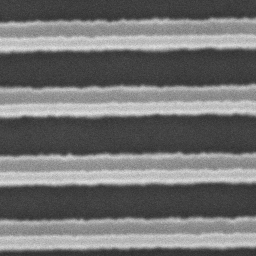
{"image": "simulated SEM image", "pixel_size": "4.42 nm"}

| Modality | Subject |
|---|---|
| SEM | lines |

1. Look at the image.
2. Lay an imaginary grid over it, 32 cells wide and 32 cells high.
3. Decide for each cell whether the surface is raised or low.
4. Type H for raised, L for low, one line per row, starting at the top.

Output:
LLLLLLLLLLLLLLLLLLLLLLLLLLLLLLLL
LLLLLLLLLLLLLLLLLLLLLLLLLLLLLLLL
LLLLLLLLLLLLLLLLLLLLLLLLLLLLLLLL
HHHHHHHHHHHHHHHHHHHHHHHHHHHHHHHH
HHHHHHHHHHHHHHHHHHHHHHHHHHHHHHHH
HHHHHHHHHHHHHHHHHHHHHHHHHHHHHHHH
LLLLLLLLLLLLLLLLLLLLLLLLLLLLLLLL
LLLLLLLLLLLLLLLLLLLLLLLLLLLLLLLL
LLLLLLLLLLLLLLLLLLLLLLLLLLLLLLLL
LLLLLLLLLLLLLLLLLLLLLLLLLLLLLLLL
LLLLLLLLLLLLLLLLLLLLLLLLLLLLLLLL
HHHHHHHHHHHHHHHHHHHHHHHHHHHHHHHH
HHHHHHHHHHHHHHHHHHHHHHHHHHHHHHHH
HHHHHHHHHHHHHHHHHHHHHHHHHHHHHHHH
LLLLLLLLLLLLLLLLLLLLLLLLLLLLLLLL
LLLLLLLLLLLLLLLLLLLLLLLLLLLLLLLL
LLLLLLLLLLLLLLLLLLLLLLLLLLLLLLLL
LLLLLLLLLLLLLLLLLLLLLLLLLLLLLLLL
LLLLLLLLLLLLLLLLLLLLLLLLLLLLLLLL
LLLLLLLLLLLLLHLLLLHLHHHHHHHHHHHH
HHHHHHHHHHHHHHHHHHHHHHHHHHHHHHHH
HHHHHHHHHHHHHHHHHHHHHHHHHHHHHHHH
HHHHHHHHHHHHHHHHHHHHHHHHHHHHHHHH
LLLLLLLLLLLLLLLLLLLLLLLLLLLLLLLL
LLLLLLLLLLLLLLLLLLLLLLLLLLLLLLLL
LLLLLLLLLLLLLLLLLLLLLLLLLLLLLLLL
LLLLLLLLLLLLLLLLLLLLLLLLLLLLLLLL
LLLLLLLLLLLLLLLHHLLLLHLHHHHHHHHH
HHHHHHHHHHHHHHHHHHHHHHHHHHHHHHHH
HHHHHHHHHHHHHHHHHHHHHHHHHHHHHHHH
HHHHHHHHHHHHHHHHHHHHHHHHHHHHHHHH
LLLLLLLLLLLLLLLLLLLLLLLLLLLLLLLL